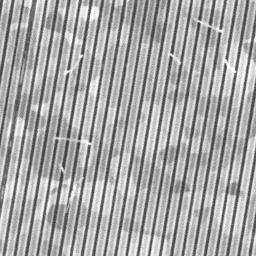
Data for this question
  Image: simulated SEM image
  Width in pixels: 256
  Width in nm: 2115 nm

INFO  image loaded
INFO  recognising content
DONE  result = parallel lines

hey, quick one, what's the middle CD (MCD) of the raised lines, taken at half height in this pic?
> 58 nm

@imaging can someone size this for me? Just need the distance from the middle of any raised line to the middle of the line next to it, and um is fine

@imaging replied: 0.0912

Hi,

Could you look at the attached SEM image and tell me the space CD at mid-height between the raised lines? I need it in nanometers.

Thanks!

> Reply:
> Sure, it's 35.7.